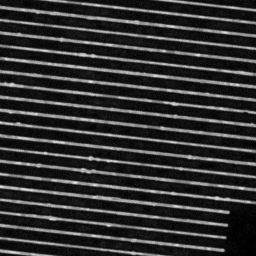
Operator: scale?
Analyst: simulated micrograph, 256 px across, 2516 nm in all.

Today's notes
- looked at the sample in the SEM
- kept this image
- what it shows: parallel lines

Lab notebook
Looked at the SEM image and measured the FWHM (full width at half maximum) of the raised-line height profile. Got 25.6 nm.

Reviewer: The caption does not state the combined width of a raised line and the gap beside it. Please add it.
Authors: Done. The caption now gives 125 nanometres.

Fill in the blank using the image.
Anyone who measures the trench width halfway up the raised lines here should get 103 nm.